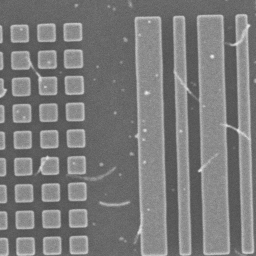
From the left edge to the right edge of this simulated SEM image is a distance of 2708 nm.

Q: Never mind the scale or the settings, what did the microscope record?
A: groups of lines, slits or small figures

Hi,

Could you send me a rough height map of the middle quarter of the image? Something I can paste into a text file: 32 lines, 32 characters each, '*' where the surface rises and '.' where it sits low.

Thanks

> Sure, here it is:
*****.............*******...**..
..................*******...**..
..................*******...**..
*****.............*******...**..
*****.............*******...**..
*****.............*******...***.
*****.............*******...***.
.****.............*******...***.
..................*******...***.
...................******...***.
*****..............******...***.
*****..............******...***.
.****..............******...***.
.****..............******...***.
...................******...***.
...................******...***.
.****..............******...***.
.****..............******...***.
.****..............******...***.
.****..............******...***.
.****..............******...***.
...................******...***.
...................******...***.
.****..............******...***.
.****..............******...***.
.****..............******....**.
.****..............******....**.
...................******....**.
...................******....**.
...................******....**.
.*****.............******....**.
.*****.............******....**.